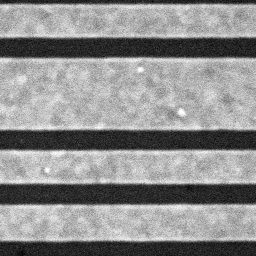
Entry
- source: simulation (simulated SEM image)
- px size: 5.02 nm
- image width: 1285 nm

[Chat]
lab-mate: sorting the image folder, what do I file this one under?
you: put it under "wiring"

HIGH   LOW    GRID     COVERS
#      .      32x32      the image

................................
################################
################################
################################
################################
................................
................................
################################
################################
################################
################################
################################
################################
################################
################################
################################
................................
................................
................................
################################
################################
################################
################################
................................
................................
................................
################################
################################
################################
################################
................................
................................